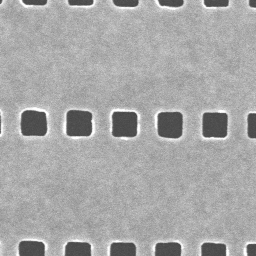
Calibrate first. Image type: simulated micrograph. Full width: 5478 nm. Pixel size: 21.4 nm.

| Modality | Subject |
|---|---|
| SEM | holes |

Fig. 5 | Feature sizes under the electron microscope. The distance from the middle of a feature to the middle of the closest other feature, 969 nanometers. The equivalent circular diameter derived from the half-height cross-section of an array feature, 619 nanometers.